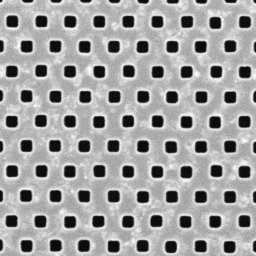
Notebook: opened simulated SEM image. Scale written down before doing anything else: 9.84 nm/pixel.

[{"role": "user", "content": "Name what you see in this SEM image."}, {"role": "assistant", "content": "a regular array of holes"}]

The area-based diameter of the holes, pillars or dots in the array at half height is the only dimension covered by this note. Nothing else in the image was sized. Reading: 133 nm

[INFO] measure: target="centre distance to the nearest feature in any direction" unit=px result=28.4